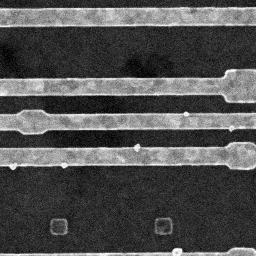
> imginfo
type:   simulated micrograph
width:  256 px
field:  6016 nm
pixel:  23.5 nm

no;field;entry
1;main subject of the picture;wiring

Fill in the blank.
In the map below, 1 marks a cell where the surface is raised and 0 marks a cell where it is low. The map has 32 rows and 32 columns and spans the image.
00000000000000000000000000000000
11111111111111111111111111111111
11111111111111111111111111111111
00000000000000000000000000000000
00000000000000000000000000000000
00000000000000000000000000000000
00000000000000000000000000000000
00000000000000000000000000000000
00000000000000000000000000000000
00000000000000000000000000001111
11111111111111111111111111111111
11111111111111111111111111111111
00000000000000000000000000001111
00000000000000000000000000000000
11111111111111111111111111111111
11111111111111111111111111111111
00011100000000000000000000000000
00000000000000000000000000000000
00000000000010011111111111111111
11111111111111111111111111111111
11111111111111111111111111111111
00000000000000000000000000000000
00000000000000000000000000000000
00000000000000000000000000000000
00000000000000000000000000000000
00000000000000000000000000000000
00000000000000000000000000000000
00000001000000000000100000000000
00000011000000000001110000000000
00000000000000000000000000000000
00000000000000000000000000000000
00000000000000000000011000001111